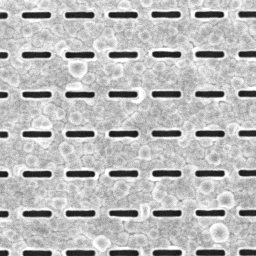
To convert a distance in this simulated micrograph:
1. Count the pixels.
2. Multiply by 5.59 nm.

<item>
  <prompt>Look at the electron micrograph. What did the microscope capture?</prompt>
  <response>a regular array of holes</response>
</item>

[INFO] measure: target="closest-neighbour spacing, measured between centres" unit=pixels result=39.5